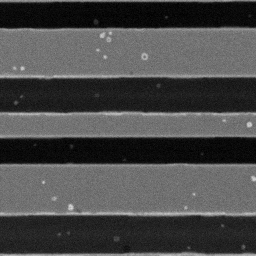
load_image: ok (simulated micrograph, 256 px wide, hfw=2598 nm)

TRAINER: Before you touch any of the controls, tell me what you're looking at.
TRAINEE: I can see lines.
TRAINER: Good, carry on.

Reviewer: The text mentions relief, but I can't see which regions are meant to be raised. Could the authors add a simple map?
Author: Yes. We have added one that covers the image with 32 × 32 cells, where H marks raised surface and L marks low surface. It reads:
LLLLLLLLLLLLLLLLLLLLLLLLLLLLLLLL
LLLLLLLLLLLLLLLLLLLLLLLLLLLLLLLL
LLLLLLLLLLLLLLLLLLLLLLLLLLLLLLLL
LLLLLLLLLLLLLLLLLLLLLLLLLLLLLLLL
HHHHHHHHHHHHHHHHHHHHHHHHHHHHHHHH
HHHHHHHHHHHHHHHHHHHHHHHHHHHHHHHH
HHHHHHHHHHHHHHHHHHHHHHHHHHHHHHHH
HHHHHHHHHHHHHHHHHHHHHHHHHHHHHHHH
HHHHHHHHHHHHHHHHHHHHHHHHHHHHHHHH
HHHHHHHHHHHHHHHHHHLLHHHHHHHHHLLH
LLLLLLLLLLLLLLLLLLLLLLLLLLLLLLLL
LLLLLLLLLLLLLLLLLLLLLLLLLLLLLLLL
LLLLLLLLLLLLLLLLLLLLLLLLLLLLLLLL
LLLLLLLLLLLLLLLLLLLLLLLLLLLLLLLL
HHHHHHHHHHHHHHHHHHHHHHHHHHHHHHHH
HHHHHHHHHHHHHHHHHHHHHHHHHHHHHHHH
HHHHHHHHHHHHHHHHHHHHHHHHHHHHHHHH
LLLLLLLLLLLLLLLLLLLLLLLLLLLLLLLL
LLLLLLLLLLLLLLLLLLLLLLLLLLLLLLLL
LLLLLLLLLLLLLLLLLLLLLLLLLLLLLLLL
LLLLLLLLLLLLLLLLLLLLLLLLLLLLLLLL
HHHHHHHHHHHHHHHHHHHHHHHHHHHHHHHH
HHHHHHHHHHHHHHHHHHHHHHHHHHHHHHHH
HHHHHHHHHHHHHHHHHHHHHHHHHHHHHHHH
HHHHHHHHHHHHHHHHHHHHHHHHHHHHHHHH
HHHHHHHHHHHHHHHHHHHHHHHHHHHHHHHH
HHHHHHHHHHHHHHHHHHHHHHHHHHHHHHHH
LLLLLLLLLLLLLLLLLLLLLLLLLLLLLLLL
LLLLLLLLLLLLLLLLLLLLLLLLLLLLLLLL
LLLLLLLLLLLLLLLLLLLLLLLLLLLLLLLL
LLLLLLLLLLLLLLLLLLLLLLLLLLLLLLLL
LLLLLLLLLLLLLLLLLLLLLLLLLLLLLLLL